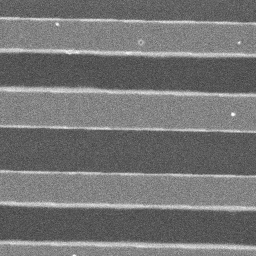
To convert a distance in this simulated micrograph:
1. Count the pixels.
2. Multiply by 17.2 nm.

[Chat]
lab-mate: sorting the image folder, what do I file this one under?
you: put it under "lines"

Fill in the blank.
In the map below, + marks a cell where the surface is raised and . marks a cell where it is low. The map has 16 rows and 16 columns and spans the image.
................
++++++++++++++++
++++++++++++++++
................
................
................
++++++++++++++++
++++++++++++++++
................
................
................
++++++++++++++++
++++++++++++++++
................
................
+++++++++++++++.